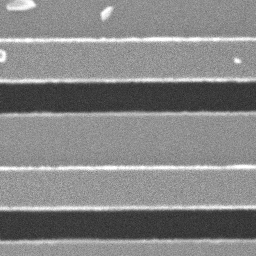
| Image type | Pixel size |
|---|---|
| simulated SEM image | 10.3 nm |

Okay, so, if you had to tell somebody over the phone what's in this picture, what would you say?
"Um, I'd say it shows lines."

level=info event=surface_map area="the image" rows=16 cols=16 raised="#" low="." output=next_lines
################
################
################
################
################
................
................
################
################
################
################
################
################
................
................
################